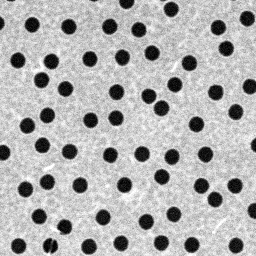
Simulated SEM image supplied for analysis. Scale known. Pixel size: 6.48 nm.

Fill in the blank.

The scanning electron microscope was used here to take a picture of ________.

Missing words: a regular array of holes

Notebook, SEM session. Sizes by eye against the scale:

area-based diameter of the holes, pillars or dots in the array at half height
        106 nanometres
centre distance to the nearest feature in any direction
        172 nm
